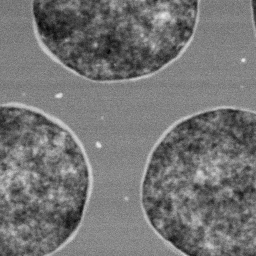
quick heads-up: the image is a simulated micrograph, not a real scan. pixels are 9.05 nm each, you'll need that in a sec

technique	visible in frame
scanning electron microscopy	holes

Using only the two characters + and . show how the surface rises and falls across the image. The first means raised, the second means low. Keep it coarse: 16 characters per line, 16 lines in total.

++..........++++
++..........++++
++..........++++
+++........+++++
+++++.....++++++
++++++++++++++++
++++++++++++++++
...++++++++.....
.....+++++......
.....+++++......
.....++++.......
......+++.......
.....++++.......
.....++++.......
.....+++++......
....+++++++.....